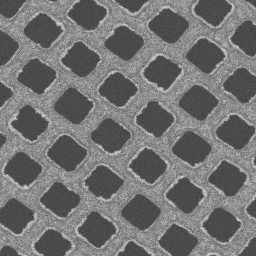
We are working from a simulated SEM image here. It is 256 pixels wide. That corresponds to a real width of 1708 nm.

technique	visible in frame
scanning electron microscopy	a regular array of holes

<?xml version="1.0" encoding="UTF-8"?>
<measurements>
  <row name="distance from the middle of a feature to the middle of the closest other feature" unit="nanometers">311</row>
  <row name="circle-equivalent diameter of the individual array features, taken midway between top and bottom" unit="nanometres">221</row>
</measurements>